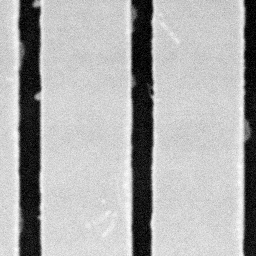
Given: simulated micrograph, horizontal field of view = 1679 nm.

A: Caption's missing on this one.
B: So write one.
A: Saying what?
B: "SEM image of lines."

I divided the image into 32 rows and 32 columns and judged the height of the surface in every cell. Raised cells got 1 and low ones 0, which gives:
11000111111111110001111111111100
11000111111111110001111111111110
11000111111111110001111111111100
11000111111111110001111111111100
11000111111111110001111111111100
11000111111111110001111111111100
11000111111111110001111111111100
11000111111111110001111111111100
11000111111111110001111111111100
11000111111111110001111111111100
11000111111111110001111111111100
11000111111111110001111111111100
11000111111111110001111111111100
11000111111111110001111111111100
11000111111111110001111111111100
11000111111111110001111111111100
11000111111111110001111111111100
11000111111111110001111111111100
11000111111111110001111111111100
11000111111111110001111111111100
11000111111111110001111111111100
11000111111111110001111111111100
11000111111111110001111111111100
11000111111111110001111111111100
11000111111111110001111111111100
11000111111111110001111111111100
11000111111111110001111111111100
11000111111111110001111111111100
11000111111111110001111111111100
11000111111111110001111111111100
11000111111111110001111111111100
11000111111111110001111111111100